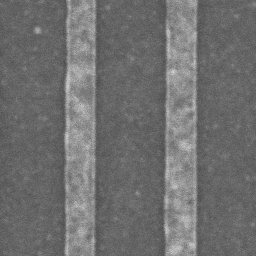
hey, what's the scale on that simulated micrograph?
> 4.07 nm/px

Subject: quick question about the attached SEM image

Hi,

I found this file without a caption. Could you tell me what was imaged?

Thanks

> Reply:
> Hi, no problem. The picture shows one or a few lines or trenches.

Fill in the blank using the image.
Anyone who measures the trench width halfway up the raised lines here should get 297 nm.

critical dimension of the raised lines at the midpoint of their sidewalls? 0.112 µm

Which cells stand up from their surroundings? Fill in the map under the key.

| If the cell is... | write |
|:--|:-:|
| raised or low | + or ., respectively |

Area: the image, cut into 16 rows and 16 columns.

....++....++....
....++....++....
....++....++....
....++....++....
....++....++....
....++....++....
....++....++....
....++....++....
....++....++....
....++....++....
....++....++....
....++....++....
....++....++....
....++....++....
....++....++....
....++....++....